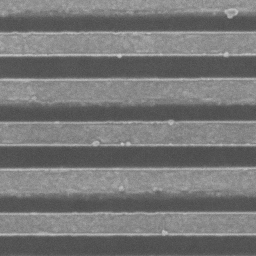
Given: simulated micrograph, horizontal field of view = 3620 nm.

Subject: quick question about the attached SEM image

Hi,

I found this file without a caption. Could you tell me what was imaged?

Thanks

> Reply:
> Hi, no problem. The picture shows lines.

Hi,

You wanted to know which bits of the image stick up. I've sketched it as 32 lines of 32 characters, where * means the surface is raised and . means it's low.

................................
............................**..
********************************
********************************
................................
................................
................................
********************************
********************************
********************************
................................
................................
................................
********************************
********************************
................................
................................
................................
********************************
********************************
********************************
................................
................................
................................
********************************
********************************
********************************
................................
................................
********************************
********************************
********************************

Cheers